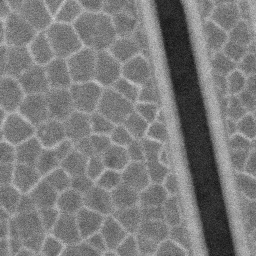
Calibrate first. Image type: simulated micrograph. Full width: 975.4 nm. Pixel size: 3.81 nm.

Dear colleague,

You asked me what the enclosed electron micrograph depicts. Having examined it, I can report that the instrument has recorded one or a few lines or trenches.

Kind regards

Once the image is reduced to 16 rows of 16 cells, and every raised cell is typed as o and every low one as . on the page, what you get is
ooooooooo...oooo
ooooooooo...oooo
oooooooooo...ooo
oooooooooo...ooo
oooooooooo...ooo
oooooooooo...ooo
oooooooooo...ooo
ooooooooooo...oo
ooooooooooo...oo
ooooooooooo...oo
ooooooooooo...oo
ooooooooooo...oo
oooooooooooo...o
oooooooooooo...o
oooooooooooo...o
oooooooooooo...o